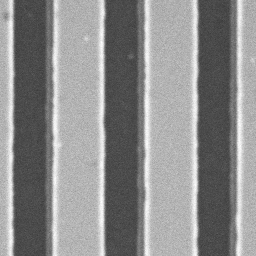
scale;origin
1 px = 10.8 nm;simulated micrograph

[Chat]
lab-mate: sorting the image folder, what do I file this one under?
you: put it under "lines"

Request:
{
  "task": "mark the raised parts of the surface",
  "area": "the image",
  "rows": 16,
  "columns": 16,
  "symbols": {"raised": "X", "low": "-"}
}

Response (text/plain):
X--XXXX--XXX---X
X--XXXX--XXX---X
X--XXX---XXX---X
X--XXX---XXX---X
X--XXX---XXX---X
X--XXX---XXX---X
X--XXX---XXX---X
X--XXX---XXX---X
X--XXXX--XXX---X
X--XXXX--XXX---X
X--XXX---XXX---X
X--XXX---XXX---X
X--XXX---XXX---X
X--XXX---XXX---X
X--XXX---XXX---X
X--XXXX--XXX---X